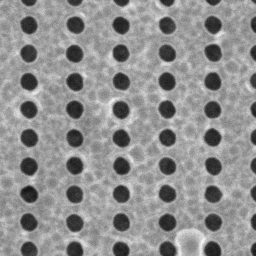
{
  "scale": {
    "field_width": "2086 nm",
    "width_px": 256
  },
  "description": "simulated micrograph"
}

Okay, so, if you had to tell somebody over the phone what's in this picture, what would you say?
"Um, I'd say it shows a regular array of holes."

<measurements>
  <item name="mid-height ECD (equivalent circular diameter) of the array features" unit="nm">148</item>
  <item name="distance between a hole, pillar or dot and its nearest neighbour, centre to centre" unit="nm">227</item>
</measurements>